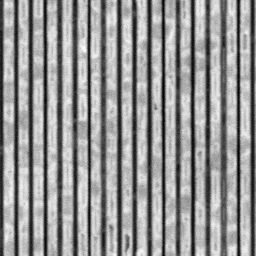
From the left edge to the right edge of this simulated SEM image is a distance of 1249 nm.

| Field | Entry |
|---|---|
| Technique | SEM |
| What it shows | parallel lines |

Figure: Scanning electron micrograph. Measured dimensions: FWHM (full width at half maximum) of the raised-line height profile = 49.4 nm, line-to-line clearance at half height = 24.4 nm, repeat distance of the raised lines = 0.0719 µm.